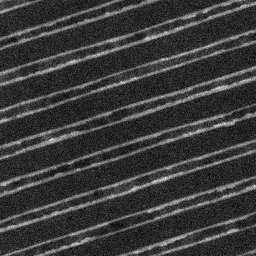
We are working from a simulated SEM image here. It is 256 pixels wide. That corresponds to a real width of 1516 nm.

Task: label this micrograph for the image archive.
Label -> parallel lines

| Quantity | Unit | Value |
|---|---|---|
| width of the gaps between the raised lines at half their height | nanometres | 135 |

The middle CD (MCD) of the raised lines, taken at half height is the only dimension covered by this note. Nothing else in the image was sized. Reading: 69.9 nanometres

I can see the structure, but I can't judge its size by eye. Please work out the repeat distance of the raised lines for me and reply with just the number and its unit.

206 nm